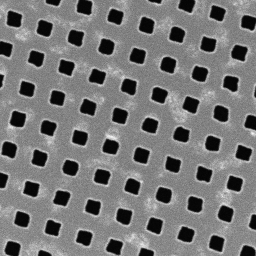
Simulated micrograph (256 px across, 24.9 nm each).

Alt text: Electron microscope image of a regular array of holes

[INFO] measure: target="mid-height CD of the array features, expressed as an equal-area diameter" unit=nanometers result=405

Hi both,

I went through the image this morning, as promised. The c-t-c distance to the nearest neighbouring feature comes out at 782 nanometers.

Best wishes